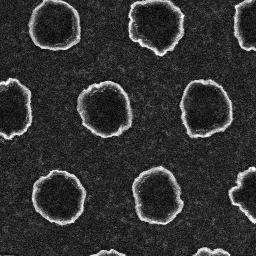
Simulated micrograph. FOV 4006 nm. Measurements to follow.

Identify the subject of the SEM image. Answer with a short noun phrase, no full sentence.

raised bodies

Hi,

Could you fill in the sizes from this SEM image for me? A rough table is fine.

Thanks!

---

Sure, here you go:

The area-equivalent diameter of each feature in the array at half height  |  798 nanometres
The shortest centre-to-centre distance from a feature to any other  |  1540 nanometers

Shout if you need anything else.